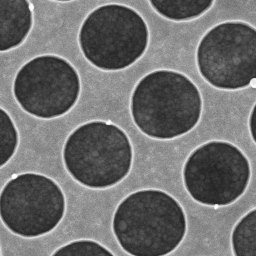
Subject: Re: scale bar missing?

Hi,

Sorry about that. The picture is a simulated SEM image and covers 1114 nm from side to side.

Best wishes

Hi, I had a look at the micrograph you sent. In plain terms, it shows holes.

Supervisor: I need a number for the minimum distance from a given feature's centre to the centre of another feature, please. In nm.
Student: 366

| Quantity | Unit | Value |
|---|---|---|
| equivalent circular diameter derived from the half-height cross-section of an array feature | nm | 289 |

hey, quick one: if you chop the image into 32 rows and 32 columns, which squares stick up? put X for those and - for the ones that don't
----XXXXXXXXXXXXXXX-------XXXXXX
----XXXXXXXX-----XXX-----XXXXXXX
----XXXXXXX-------XXXXXXXXXXXXXX
----XXXXXX--------XXXXXXXXX-----
---XXXXXXX--------XXXXXXXX------
--XXXXXXXX--------XXXXXXX-------
XXXXXXXXXX--------XXXXXXX-------
XXXX----XXX------XXXXXXXX-------
XXX------XXX---XXXXXXXXXX-------
XX--------XXXXXXXX-----XX-------
XX--------XXXXXXX-------XX-----X
XX--------XXXXXXX--------XXXXXXX
XX-------XXXXXXX---------XXXXXXX
XXX------XXXXXXX---------XXXXXXX
-XXXX--XXXXXXXXXX--------XXXXXX-
--XXXXXXXXX--XXXX-------XXXXXXX-
--XXXXXXX------XXX-----XXXXXXXX-
--XXXXXX--------XXXXXXXXXXXXXXXX
--XXXXXX--------XXXXXXXXX-----XX
-XXXXXXX--------XXXXXXXX------XX
XXXXXXXX--------XXXXXXX--------X
XXXXXXXXX-------XXXXXXX--------X
XX----XXXX-----XXXXXXXX--------X
X------XXXXXXXXXXXXXXXX--------X
--------XXXXXXXX-----XXX------XX
--------XXXXXXX-------XXXX--XXXX
--------XXXXXX---------XXXXXXXX-
-------XXXXXXX---------XXXXXXX--
X------XXXXXXX---------XXXXXX---
XXX-XXXXXXXXXXX--------XXXXXX---
XXXXXXXXX---XXX-------XXXXXXX---
XXXXXXX-------XX-----XXXXXXXX---